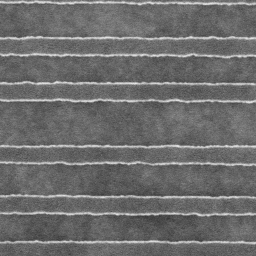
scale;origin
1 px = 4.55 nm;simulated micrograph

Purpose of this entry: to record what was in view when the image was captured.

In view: lines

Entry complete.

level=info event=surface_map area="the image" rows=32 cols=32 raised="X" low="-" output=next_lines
-----------------X---------XX--X
--------------------------------
--------------------------------
--------------------------------
--------------------------------
XXXXXXXXXXXXXXXXXXXXXXXXXXXXXXXX
XXXXXXXXXXXXXXXXXXXXXXXXXXXXXXXX
--------------------------------
--------------------------------
--------------------------------
XXXXXXXXXXXXXXXXXXXXXXXXXXXXXXXX
XXXXXXXXXXXXXXXXXXXXXXXXXXXXXXXX
XXXXXXXXXXXXXXXXXXXXXXXXXXXXXXXX
--------------------------------
--------------------------------
--------------------------------
--------------------------------
--------------------------------
XXXXXXXXXXXXXXXXXXXXXXXXXXXXXXXX
XXXXXXXXXXXXXXXXXXXXXXXXXXXXXXXX
--------XXX-------XXX-X--XXXXXXX
--------------------------------
--------------------------------
--------------------------------
XXXXXXXXXXXX--XXX---------------
XXXXXXXXXXXXXXXXXXXXXXXXXXXXXXXX
XXXXXXXXXXXXXXXXXXXXXXXXXXXXXXXX
--------------------------------
--------------------------------
--------------------------------
XXXXXXXXXXXXXXXXXXXXXXXXXXXXXXXX
XXXXXXXXXXXXXXXXXXXXXXXXXXXXXXXX